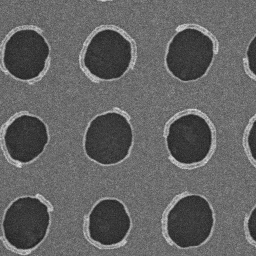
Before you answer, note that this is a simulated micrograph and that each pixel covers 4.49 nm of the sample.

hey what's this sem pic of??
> a regular array of holes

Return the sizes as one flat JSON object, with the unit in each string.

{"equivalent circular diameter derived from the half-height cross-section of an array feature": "220 nm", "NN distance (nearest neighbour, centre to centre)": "366 nanometres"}